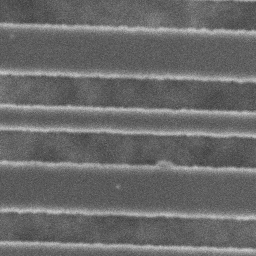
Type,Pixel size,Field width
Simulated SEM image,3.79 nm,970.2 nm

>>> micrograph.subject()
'lines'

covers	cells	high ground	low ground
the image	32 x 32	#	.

................................
................................
................................
##################..#...........
################################
################################
################################
################################
################################
........########################
................................
................................
................................
############....................
################################
################################
............####################
................................
................................
................................
#########...........#...........
################################
################################
################################
################################
################################
..#.############################
................................
................................
................................
#########.#.....................
################################